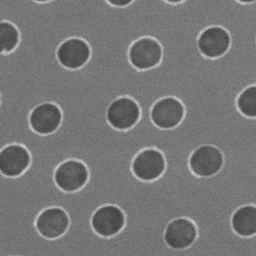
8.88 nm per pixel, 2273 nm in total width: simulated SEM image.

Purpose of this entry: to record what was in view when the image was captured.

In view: a regular array of holes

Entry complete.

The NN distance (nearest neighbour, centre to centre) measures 56.2 px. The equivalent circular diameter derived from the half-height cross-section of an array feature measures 279 nm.